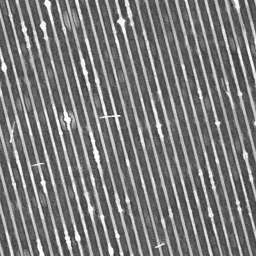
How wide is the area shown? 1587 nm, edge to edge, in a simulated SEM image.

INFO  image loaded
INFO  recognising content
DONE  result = parallel lines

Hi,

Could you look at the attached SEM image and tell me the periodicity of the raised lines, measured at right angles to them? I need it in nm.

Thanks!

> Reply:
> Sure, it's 59.7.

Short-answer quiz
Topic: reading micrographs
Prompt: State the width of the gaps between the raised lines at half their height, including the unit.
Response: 47.3 nanometres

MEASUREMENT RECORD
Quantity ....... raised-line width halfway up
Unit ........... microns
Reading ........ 0.0113